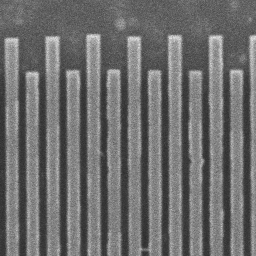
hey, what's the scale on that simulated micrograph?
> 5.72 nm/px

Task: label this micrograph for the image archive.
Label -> parallel lines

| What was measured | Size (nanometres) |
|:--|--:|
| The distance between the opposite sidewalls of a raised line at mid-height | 70.8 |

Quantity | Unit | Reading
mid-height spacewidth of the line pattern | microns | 0.045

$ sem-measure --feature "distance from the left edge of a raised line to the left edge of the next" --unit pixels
20.4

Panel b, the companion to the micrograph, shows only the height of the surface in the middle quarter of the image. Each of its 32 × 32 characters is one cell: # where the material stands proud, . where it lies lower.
......###.......###.......###...
......###.......###.......###...
.###..###..###..###..###..###..#
.###..###..###..###..###..###..#
.###..###..###..###..###..###..#
.###..###..###..###..###..###..#
.###..###..###..###..###..###..#
.###..###..###..###..###..###..#
.###..###..###..###..###..###..#
.###..###..###..###..###..###..#
.###..###..###..###..###..###..#
.###..###..###..###..###..###..#
.###..###..###..###..###..###..#
.###..###..###..###..###..###...
.###..###..###..###..###..###..#
.###..###..###..###..###..###..#
.###..###..###..###..###..###..#
.###..###..###..###..###..###..#
.###..###..###..###..###..###..#
.###..###..###..###..###..###..#
.###..###..###..###..###..###...
.###..###..###..###..###..###..#
.###..###..###..###..###..###..#
.###..###..###..###..###..###...
.###..###..###..###..###..###...
.###..###..###..###..###..###...
.###..###..###..###..###..###...
.###..###..###..###..###..###...
.###..###..###..###..###..###...
.###..###..###..###..###..###...
.###..###..###..###..###..###...
.###..###..###..###..###...##...